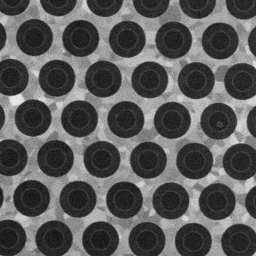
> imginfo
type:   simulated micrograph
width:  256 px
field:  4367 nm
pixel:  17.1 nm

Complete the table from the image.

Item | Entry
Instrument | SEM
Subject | an array of small figures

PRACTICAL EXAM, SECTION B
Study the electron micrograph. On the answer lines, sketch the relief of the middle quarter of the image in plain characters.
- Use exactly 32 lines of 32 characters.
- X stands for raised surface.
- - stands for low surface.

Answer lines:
--XXXX-------XXXXX-------XXXXX--
---XXX---XX---XXX---------XXX---
---XX---XXXX--XXX--XXXX---XXX--X
X--XX--XXXXX---XX--XXXXX--XX---X
X--XX--XXXXX---XX--XXXXX--XX---X
---XX---XXXX--XXX--XXXX---XX---X
--XXXX--------XXX--------XXXX---
-XXXXXX------XXXXX-------XXXXX--
XXXXXXXXX-XXXXXXXXXX---XXXXXXXX-
XX----XXXXXXXX---XXXXXXXXX--XXXX
-------XXXXX-------XXXXX------XX
---XX---XXX---------XXX--------X
--XXXX--XXX--XXXXX--XXX--XXXX---
-XXXXX---XX--XXXXX--XX---XXXX---
-XXXXX---XX--XXXXX--XX---XXXX---
--XXXX--XXX---XXX---XXX--XXXX---
--------XXX---------XXX---XX---X
X------XXXXX-------XXXXX------XX
XXX-XXXXXXXXXX---XXXXXXXX----XXX
XXXXXXXX---XXXXXXXXX--XXXXXXXXXX
-XXXXX-------XXXXX------XXXXXX--
--XXX----X----XXX--------XXXX---
--XXX--XXXXX--XXX--XXXX---XX---X
---XX--XXXXX--XX---XXXXX--XX--XX
---XX--XXXXX--XX---XXXXX--XX--XX
--XXX---XXX---XXX--XXXX---XX--XX
--XXXX-------XXXX----X---XXX---X
-XXXXX------XXXXXX------XXXXX---
XXXXXXXXX-XXXXXXXXX----XXXXXXXX-
XX----XXXXXXXX---XXXXXXXXX--XXXX
-------XXXXX------XXXXXX------XX
--XXX---XXX---XX---XXXX--------X